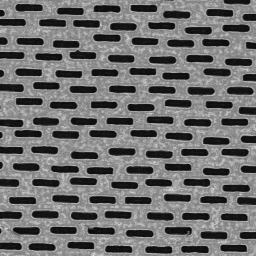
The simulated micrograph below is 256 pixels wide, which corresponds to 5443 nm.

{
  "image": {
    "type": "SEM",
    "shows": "a regular array of holes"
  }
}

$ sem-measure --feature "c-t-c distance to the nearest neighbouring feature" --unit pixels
22.3